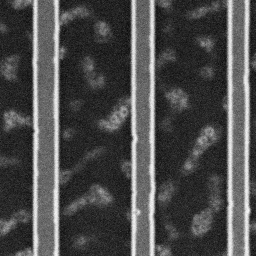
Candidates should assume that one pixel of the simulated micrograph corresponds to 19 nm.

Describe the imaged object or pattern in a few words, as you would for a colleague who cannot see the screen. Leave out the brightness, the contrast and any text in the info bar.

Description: one or a few lines or trenches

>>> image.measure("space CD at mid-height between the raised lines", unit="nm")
1470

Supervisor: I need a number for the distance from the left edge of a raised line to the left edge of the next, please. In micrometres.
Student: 1.82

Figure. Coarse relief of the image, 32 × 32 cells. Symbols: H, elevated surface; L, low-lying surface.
LLLLHHHLLLLLLLLLLHHLLLLLLLLLLHHL
LLLLHHHLLLLLLLLLLHHLLLLLLLLLLHHL
LLLLHHHLLLLLLLLLLHHLLLLLLLLLLHHL
LLLLHHHLLLLLLLLLLHHLLLLLLLLLLHHL
LLLLHHHLLLLLLLLLLHHLLLLLLLLLLHHL
LLLLHHHLLLLLLLLLLHHLLLLLLLLLLHHL
LLLLHHHLLLLLLLLLLHHLLLLLLLLLLHHL
LLLLHHHLLLLLLLLLLHHLLLLLLLLLLHHL
LLLLHHHLLLLLLLLLLHHLLLLLLLLLLHHL
LLLLHHHLLLLLLLLLLHHLLLLLLLLLLHHL
LLLLHHHLLLLLLLLLLHHLLLLLLLLLLHHL
LLLLHHHLLLLLLLLLLHHLLLLLLLLLLHHL
LLLLHHHLLLLLLLLLLHHLLLLLLLLLLHHL
LLLLHHHLLLLLLLLLLHHLLLLLLLLLLHHL
LLLLLHHLLLLLLLLLLHHLLLLLLLLLLHHL
LLLLHHHLLLLLLLLLLHHLLLLLLLLLLHHL
LLLLLHHLLLLLLLLLLHHLLLLLLLLLLHHL
LLLLHHHLLLLLLLLLLHHLLLLLLLLLLHHL
LLLLHHHLLLLLLLLLLHHLLLLLLLLLLHHL
LLLLHHHLLLLLLLLLLHHLLLLLLLLLLHHL
LLLLHHHLLLLLLLLLLHHLLLLLLLLLLHHL
LLLLHHHLLLLLLLLLLHHLLLLLLLLLLHHL
LLLLHHHLLLLLLLLLLHHLLLLLLLLLLHHL
LLLLHHHLLLLLLLLLLHHLLLLLLLLLLHHL
LLLLHHHLLLLLLLLLLHHLLLLLLLLLLHHL
LLLLHHHLLLLLLLLLLHHLLLLLLLLLLHHL
LLLLHHHLLLLLLLLLLHHLLLLLLLLLLHHL
LLLLHHHLLLLLLLLLLHHLLLLLLLLLLHHL
LLLLHHHLLLLLLLLLLHHLLLLLLLLLLHHL
LLLLHHHLLLLLLLLLLHHLLLLLLLLLLHHL
LLLLHHHLLLLLLLLLLHHLLLLLLLLLLHHL
LLLLHHHLLLLLLLLLLHHLLLLLLLLLLHHL